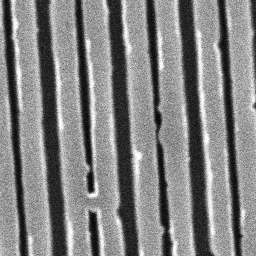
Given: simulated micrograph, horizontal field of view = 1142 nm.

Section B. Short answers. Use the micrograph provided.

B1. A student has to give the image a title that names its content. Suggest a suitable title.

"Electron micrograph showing parallel lines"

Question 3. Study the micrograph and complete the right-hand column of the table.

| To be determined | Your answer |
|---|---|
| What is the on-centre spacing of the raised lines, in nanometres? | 162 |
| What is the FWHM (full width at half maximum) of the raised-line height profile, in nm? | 107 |